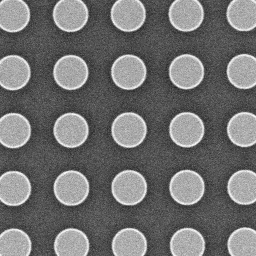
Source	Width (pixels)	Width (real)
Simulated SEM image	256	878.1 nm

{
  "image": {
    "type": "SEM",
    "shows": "an array of small figures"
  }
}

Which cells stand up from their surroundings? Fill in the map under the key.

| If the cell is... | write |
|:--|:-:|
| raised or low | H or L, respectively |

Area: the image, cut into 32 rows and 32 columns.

HHHLLLLHHHLLLLHHHHLLLLHHHLLLLHHH
HHHHLLLHHHHLLLHHHHLLLHHHHLLLHHHH
HHHHLLLHHHHLLLHHHHLLLHHHHLLLLHHH
HHHLLLLLHHLLLLLHHLLLLLHHLLLLLHHH
LLLLLLLLLLLLLLLLLLLLLLLLLLLLLLLL
LLLLLLLLLLLLLLLLLLLLLLLLLLLLLLLL
LLLLLLLLLLLLLLLLLLLLLLLLLLLLLLLL
HHHLLLLHHHLLLLLHHHLLLLHHHLLLLHHH
HHHHLLLHHHHLLLHHHHLLLHHHHLLLHHHH
HHHHLLLHHHHLLLHHHHLLLHHHHLLLLHHH
HHHLLLLHHHLLLLLHHHLLLLHHHLLLLHHH
LLLLLLLLLLLLLLLLLLLLLLLLLLLLLLLL
LLLLLLLLLLLLLLLLLLLLLLLLLLLLLLLL
LLLLLLLLLLLLLLLLLLLLLLLLLLLLLLLL
LHHLLLLLHHLLLLLHHLLLLLHHHLLLLHHH
HHHHLLLHHHHLLLHHHHLLLHHHHLLLLHHH
HHHHLLLHHHHLLLHHHHLLLHHHHLLLHHHH
HHHLLLLHHHHLLLHHHHLLLLHHHLLLLHHH
LLLLLLLLLLLLLLLLLLLLLLLLLLLLLLLL
LLLLLLLLLLLLLLLLLLLLLLLLLLLLLLLL
LLLLLLLLLLLLLLLLLLLLLLLLLLLLLLLL
LLLLLLLLHHLLLLLHHLLLLLHHLLLLLLHH
HHHHLLLHHHHLLLHHHHLLLHHHHLLLLHHH
HHHHLLLHHHHLLLHHHHLLLHHHHLLLLHHH
HHHHLLLHHHHLLLHHHHLLLLHHHLLLLHHH
LHHLLLLLHHLLLLLHHLLLLLLHLLLLLLLL
LLLLLLLLLLLLLLLLLLLLLLLLLLLLLLLL
LLLLLLLLLLLLLLLLLLLLLLLLLLLLLLLL
LLLLLLLLLLLLLLLLLLLLLLLLLLLLLLLL
HHHLLLLHHHHLLLHHHHLLLLHHHLLLLHHH
HHHHLLLHHHHLLLHHHHLLLHHHHLLLLHHH
HHHHLLLHHHHLLLHHHHLLLHHHHLLLLHHH